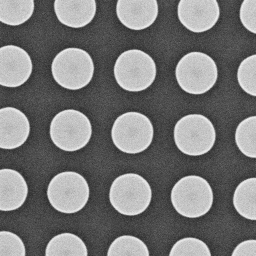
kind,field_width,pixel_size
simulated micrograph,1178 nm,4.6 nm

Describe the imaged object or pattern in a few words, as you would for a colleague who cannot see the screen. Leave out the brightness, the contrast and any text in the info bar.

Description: an array of small figures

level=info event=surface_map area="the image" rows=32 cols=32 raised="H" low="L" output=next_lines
HHHHLLLHHHHHLLLHHHHHLLHHHHHLLLHH
HHHHLLLHHHHHLLLHHHHHLLHHHHHLLLHH
HHHLLLLHHHHLLLLHHHHLLLLHHHHLLLHH
LLLLLLLLLLLLLLLLHHLLLLLHHHLLLLLH
LLLLLLLLLLLLLLLLLLLLLLLLLLLLLLLL
LLLLLLLLLLLLLLLLLLLLLLLLLLLLLLLL
HHHLLLLLHHHLLLLLHHLLLLLLLLLLLLLL
HHHHLLLHHHHLLLLHHHHLLLLHHHHLLLLH
HHHHLLLHHHHHLLHHHHHLLLHHHHHLLLHH
HHHHLLLHHHHLLLHHHHHLLLHHHHHLLLHH
HHHLLLLHHHHLLLLHHHHLLLHHHHHLLLHH
LLLLLLLLLLLLLLLLLLLLLLLLHHLLLLLH
LLLLLLLLLLLLLLLLLLLLLLLLLLLLLLLL
LLLLLLLLLLLLLLLLLLLLLLLLLLLLLLLL
HHHLLLLHHHHLLLLHHHLLLLLHHLLLLLLL
HHHHLLHHHHHLLLHHHHHLLLHHHHLLLLHH
HHHHLLHHHHHLLLHHHHHLLLHHHHHLLLHH
HHHLLLLHHHHLLLHHHHHLLLHHHHHLLLHH
HHLLLLLLHHLLLLLHHHLLLLHHHHLLLLHH
LLLLLLLLLLLLLLLLLLLLLLLLLLLLLLLH
LLLLLLLLLLLLLLLLLLLLLLLLLLLLLLLL
HHLLLLLLLLLLLLLLLLLLLLLLLLLLLLLL
HHHLLLLHHHHLLLHHHHLLLLLHHHLLLLLH
HHHLLLHHHHHLLLHHHHHLLLHHHHLLLLHH
HHHLLLHHHHHLLLHHHHHLLHHHHHHLLHHH
HHHLLLHHHHHLLLHHHHHLLLHHHHLLLHHH
LLLLLLLLHLLLLLLHHHLLLLHHHHLLLLHH
LLLLLLLLLLLLLLLLLLLLLLLLLLLLLLLL
LLLLLLLLLLLLLLLLLLLLLLLLLLLLLLLL
HHLLLLLHHLLLLLLLLLLLLLLLLLLLLLLL
HHHLLLHHHHLLLLHHHHLLLLHHHHLLLLHH
HHHLLLHHHHHLLLHHHHHLLHHHHHLLLHHH